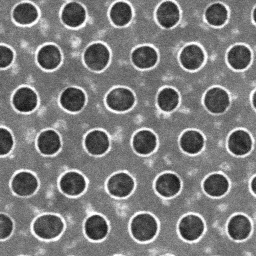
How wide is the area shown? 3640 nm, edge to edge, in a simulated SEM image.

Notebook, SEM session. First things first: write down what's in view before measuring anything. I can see a regular array of holes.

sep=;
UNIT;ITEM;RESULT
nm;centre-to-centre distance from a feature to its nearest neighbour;677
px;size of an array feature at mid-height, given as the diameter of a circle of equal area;25.9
